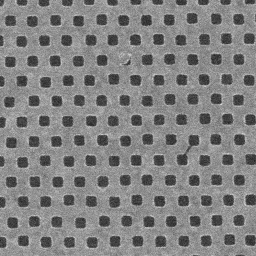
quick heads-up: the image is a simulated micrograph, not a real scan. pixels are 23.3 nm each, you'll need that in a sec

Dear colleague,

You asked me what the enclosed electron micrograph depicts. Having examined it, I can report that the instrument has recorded a regular array of holes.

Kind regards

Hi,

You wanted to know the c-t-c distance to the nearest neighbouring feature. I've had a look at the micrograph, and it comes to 515 nanometres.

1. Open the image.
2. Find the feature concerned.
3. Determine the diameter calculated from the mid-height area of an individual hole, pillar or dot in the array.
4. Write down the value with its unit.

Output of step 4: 293 nm